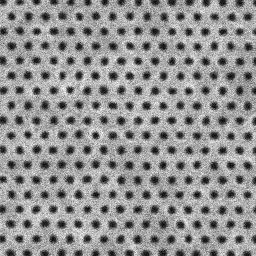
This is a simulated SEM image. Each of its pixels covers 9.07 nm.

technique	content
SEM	a regular array of holes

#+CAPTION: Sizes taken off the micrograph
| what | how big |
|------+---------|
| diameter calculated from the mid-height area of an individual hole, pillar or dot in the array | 83.8 nanometers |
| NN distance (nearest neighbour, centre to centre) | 0.15 µm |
